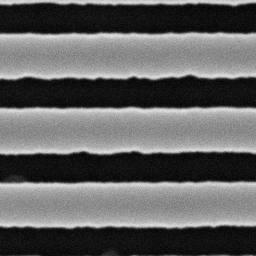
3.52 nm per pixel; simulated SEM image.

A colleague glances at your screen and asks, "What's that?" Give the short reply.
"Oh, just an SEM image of lines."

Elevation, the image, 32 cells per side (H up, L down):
LLLLLLLLLLLLLLLLLLLLLLLLLLLLHHLL
LLLLLLLLLLLLLLLLLLLLLLLLLLLLLLLL
LLLLLLLLLLLLLLLLLLLLLLLLLLLLLLLL
LLLLLLLLLLLLLLLLLLLLLLLLLLLLLLLL
HHHHHHHHHHHHHHHHHHHHHHHHHHHHHHHH
HHHHHHHHHHHHHHHHHHHHHHHHHHHHHHHH
HHHHHHHHHHHHHHHHHHHHHHHHHHHHHHHH
HHHHHHHHHHHHHHHHHHHHHHHHHHHHHHHH
HHHHHHHHHHHHHHHHHHHHHHHHHHHHHHHH
HHHHHHHHHHHHHHHHHHHHHHHLHHHHHHHH
LLLLLLLLLLLLLLLLLLLLLLLLLLLLLLLL
LLLLLLLLLLLLLLLLLLLLLLLLLLLLLLLL
LLLLLLLLLLLLLLLLLLLLLLLLLLLLLLLL
LLLLLLLLLLLLLLLLLLLLLLLLLLHHLLLL
HHHHHHHHHHHHHHHHHHHHHHHHHHHHHHHH
HHHHHHHHHHHHHHHHHHHHHHHHHHHHHHHH
HHHHHHHHHHHHHHHHHHHHHHHHHHHHHHHH
HHHHHHHHHHHHHHHHHHHHHHHHHHHHHHHH
HHHHHHHHHHHHHHHHHHHHHHHHHHHHHHHH
LLLLLLLLLLLLLLLLLLLLLLLLLLLLLLLL
LLLLLLLLLLLLLLLLLLLLLLLLLLLLLLLL
LLLLLLLLLLLLLLLLLLLLLLLLLLLLLLLL
LLLLLLLLLLLLLLLLLLLLLLLLLLLLLLLL
HHHHHHHHHHHHHHHHHHHHHHHHHHHHHHHH
HHHHHHHHHHHHHHHHHHHHHHHHHHHHHHHH
HHHHHHHHHHHHHHHHHHHHHHHHHHHHHHHH
HHHHHHHHHHHHHHHHHHHHHHHHHHHHHHHH
HHHHHHHHHHHHHHHHHHHHHHHHHHHHHHHH
LLLLLLLLLLLLLLLLLLLLLLLLLLLLLLLL
LLLLLLLLLLLLLLLLLLLLLLLLLLLLLLLL
LLLLLLLLLLLLLLLLLLLLLLLLLLLLLLLL
LLLLLLLLLLLLLLLLLLLLLLLLLLLLLLLL